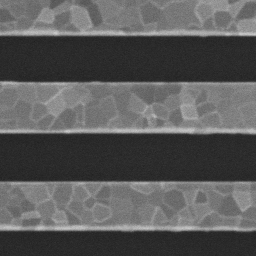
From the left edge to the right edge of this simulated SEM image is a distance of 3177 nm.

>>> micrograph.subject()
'lines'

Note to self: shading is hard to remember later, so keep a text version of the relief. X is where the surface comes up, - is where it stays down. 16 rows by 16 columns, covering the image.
XXXXXXXXXXXXXXXX
XXXXXXXXXXXXXXXX
----------------
----------------
----------------
XXXXXXXXXXXXXXXX
XXXXXXXXXXXXXXXX
XXXXXXXXXXXXXXXX
----------------
----------------
----------------
XXXXXXXXXXXXXXXX
XXXXXXXXXXXXXXXX
XXXXXXXXXXXXXXXX
----------------
----------------